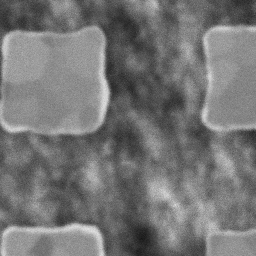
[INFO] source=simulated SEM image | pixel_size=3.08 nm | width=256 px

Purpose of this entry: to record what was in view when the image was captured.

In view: raised bodies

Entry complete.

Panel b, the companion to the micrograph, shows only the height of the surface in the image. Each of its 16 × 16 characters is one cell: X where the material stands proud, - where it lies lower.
----------------
----------------
XXXXXXX------XXX
XXXXXXX------XXX
XXXXXXX------XXX
XXXXXXX------XXX
XXXXXXX------XXX
XXXXXX-------XXX
----------------
----------------
----------------
----------------
----------------
----------------
-XXXXX--------XX
XXXXXX-------XXX